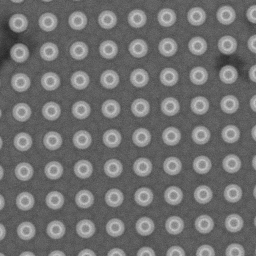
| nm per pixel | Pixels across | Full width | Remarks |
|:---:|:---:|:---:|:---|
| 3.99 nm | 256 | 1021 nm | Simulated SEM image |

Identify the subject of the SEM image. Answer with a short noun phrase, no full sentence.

an array of small figures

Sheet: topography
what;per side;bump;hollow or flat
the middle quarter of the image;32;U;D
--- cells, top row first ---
DDDDDDDDDDDDDDDDDDDDDDDDDDDDDDDD
DDDDDDDDDDDDDDDDDDUUDDDDDUUUDDDD
DDUUUUDDDUUUUDDDDUUUUDDDUUUUDDDD
DDUUUUDDDUUUUUDDDUUUUDDDUUUUDDDD
DDUUUUDDDUUUUUDDDUUUUDDDUUUUDDDD
DDUUUUDDDDUUUDDDDDUUDDDDDDDDDDDD
DDDDDDDDDDDDDDDDDDDDDDDDDDDDDDDD
DDDDDDDDDDDDDDDDDDDDDDDDDDDDDDDD
DDDDDDDDDDDDDDDDDDDDDDDDDDUDDDDD
DDDUUDDDDDUUUDDDDUUUUDDDDUUUDDDD
DDUUUUDDDDUUUUDDDUUUUDDDUUUUUDDD
DDUUUUDDDUUUUUDDDUUUUDDDUUUUUDDD
DDUUUUDDDDUUUUDDDUUUUDDDDUUUDDDD
DDDUUDDDDDDDDDDDDDDDDDDDDDDDDDDD
DDDDDDDDDDDDDDDDDDDDDDDDDDDDDDDD
DDDDDDDDDDDDDDDDDDDDDDDDDDDDDDDD
DDDDDDDDDDDUUDDDDDUUUDDDDUUUDDDD
DDDUUUDDDDUUUUDDDUUUUDDDDUUUUDDD
DDUUUUUDDDUUUUDDDUUUUUDDDUUUUDDD
DDUUUUUDDDUUUUDDDUUUUDDDDUUUUDDD
DDDUUUDDDDDUUDDDDDDUDDDDDDDDDDDD
DDDDDDDDDDDDDDDDDDDDDDDDDDDDDDDD
DDDDDDDDDDDDDDDDDDDDDDDDDDDDDDDD
DDDDDDDDDDDDDDDDDDDDDDDDDDUUDDDD
DDDUUUDDDDDUUUDDDDUUUUDDDUUUUDDD
DDDUUUUDDDUUUUUDDUUUUUDDDUUUUDDD
DDDUUUUDDDUUUUUDDUUUUUDDDUUUUDDD
DDDUUUUDDDDUUUDDDDUUUDDDDDUUDDDD
DDDDUDDDDDDDDDDDDDDDDDDDDDDDDDDD
DDDDDDDDDDDDDDDDDDDDDDDDDDDDDDDD
DDDDDDDDDDDDDDDDDDDDDDDDDDDDDDDD
DDDDDDDDDDDUUUDDDDUUUUDDDDUUUDDD